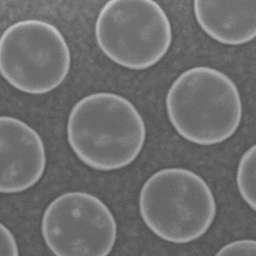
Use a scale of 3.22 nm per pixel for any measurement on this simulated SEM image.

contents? raised bodies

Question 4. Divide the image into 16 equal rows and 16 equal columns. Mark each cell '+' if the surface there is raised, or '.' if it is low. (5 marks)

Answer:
.......+++..++++
.++...+++++..+++
++++..+++++...+.
++++...+++......
++++........++..
.++........++++.
.....+++..+++++.
+...+++++..++++.
++..+++++..+++..
+++..++++.......
+++...+........+
++.......++++..+
....++...++++..+
...++++..++++...
+..++++...+++...
+..++++.......++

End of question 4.